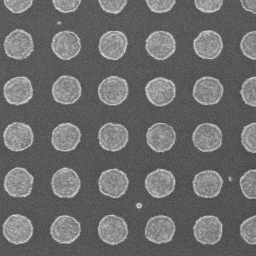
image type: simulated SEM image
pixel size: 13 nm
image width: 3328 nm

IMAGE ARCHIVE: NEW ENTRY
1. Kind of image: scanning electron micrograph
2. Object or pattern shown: a regular array of raised bodies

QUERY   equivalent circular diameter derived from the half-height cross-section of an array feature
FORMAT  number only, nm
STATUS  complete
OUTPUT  367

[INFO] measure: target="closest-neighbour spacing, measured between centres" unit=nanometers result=597